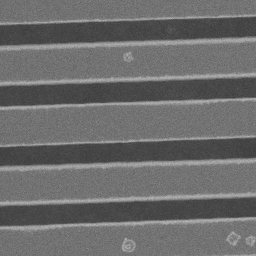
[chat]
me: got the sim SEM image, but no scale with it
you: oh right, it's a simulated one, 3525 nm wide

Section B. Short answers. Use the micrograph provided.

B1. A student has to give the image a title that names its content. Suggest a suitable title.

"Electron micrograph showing lines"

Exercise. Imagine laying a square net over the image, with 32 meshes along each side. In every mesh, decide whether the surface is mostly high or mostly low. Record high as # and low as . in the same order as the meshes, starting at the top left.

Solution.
################################
################################
##################..............
................................
................................
.......#########################
################################
################################
################################
################################
#######.........................
................................
..........................######
################################
################################
################################
################################
######################..........
................................
................................
...........#####################
################################
################################
################################
################################
######..........................
................................
........................########
################################
################################
################################
################################